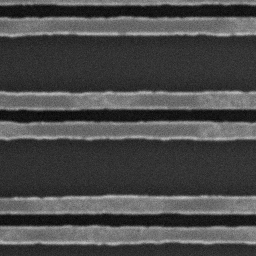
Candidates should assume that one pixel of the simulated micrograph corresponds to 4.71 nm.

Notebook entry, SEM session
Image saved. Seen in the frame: lines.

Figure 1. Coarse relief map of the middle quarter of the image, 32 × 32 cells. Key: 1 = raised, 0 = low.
00000000000000000000000000000000
00000000000000000000000000000000
00000000000000000000000000000000
00000000000000000000000000000000
00000000000000000000000000000000
00000000000000000000000000000000
00000000000000000000000000000000
10000111111111111111111111111111
11111111111111111111111111111111
11111111111111111111111111111111
11111111111111111111111111111111
00000000000000000000000000000000
00000000000000000000000000000000
00000000000000000000000000000000
00000000000000000000000000000000
11111111111111111111111111111111
11111111111111111111111111111111
11111111111111111111111111111111
01111111100111100000011111111111
00000000000000000000000000000000
00000000000000000000000000000000
00000000000000000000000000000000
00000000000000000000000000000000
00000000000000000000000000000000
00000000000000000000000000000000
00000000000000000000000000000000
00000000000000000000000000000000
00000000000000000000000000000000
00000000000000000000000000000000
00000000000000000000000000000000
00000000000000000000000000000000
00000000000000000000000000000000